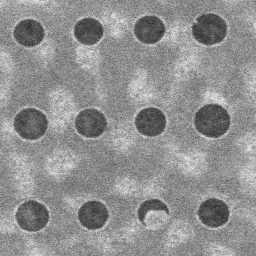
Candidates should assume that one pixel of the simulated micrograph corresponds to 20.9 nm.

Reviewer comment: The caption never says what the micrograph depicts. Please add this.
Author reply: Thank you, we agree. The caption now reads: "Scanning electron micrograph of a regular array of holes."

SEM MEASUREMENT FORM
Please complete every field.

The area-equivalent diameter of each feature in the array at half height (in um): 0.666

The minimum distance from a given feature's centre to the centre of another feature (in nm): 1260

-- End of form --